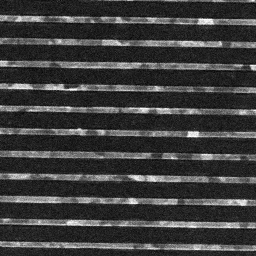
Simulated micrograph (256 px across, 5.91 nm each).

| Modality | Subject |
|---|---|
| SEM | parallel lines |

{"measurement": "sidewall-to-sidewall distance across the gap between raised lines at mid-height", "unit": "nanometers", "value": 102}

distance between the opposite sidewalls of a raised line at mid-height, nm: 31.8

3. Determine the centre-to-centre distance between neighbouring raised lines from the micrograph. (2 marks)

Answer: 0.133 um